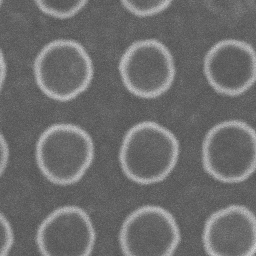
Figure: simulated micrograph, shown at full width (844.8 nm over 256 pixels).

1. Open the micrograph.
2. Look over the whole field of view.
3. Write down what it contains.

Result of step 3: raised bodies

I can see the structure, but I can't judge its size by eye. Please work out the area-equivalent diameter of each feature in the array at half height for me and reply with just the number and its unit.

0.181 microns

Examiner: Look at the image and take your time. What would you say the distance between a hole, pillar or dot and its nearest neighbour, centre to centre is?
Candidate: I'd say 83.7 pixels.